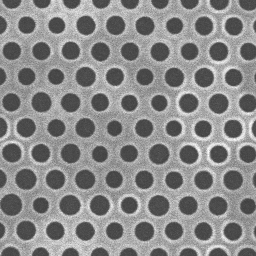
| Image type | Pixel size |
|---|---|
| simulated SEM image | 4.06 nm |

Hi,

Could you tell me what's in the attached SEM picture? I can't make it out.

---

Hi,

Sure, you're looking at a regular array of holes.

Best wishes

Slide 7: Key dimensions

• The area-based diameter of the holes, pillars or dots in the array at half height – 0.0753 microns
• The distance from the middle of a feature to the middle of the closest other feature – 0.118 micrometres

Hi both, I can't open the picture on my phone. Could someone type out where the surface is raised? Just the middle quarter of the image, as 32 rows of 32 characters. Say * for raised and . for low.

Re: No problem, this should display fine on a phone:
********************************
****...****...*****..*****...***
***.....***....***....***.....**
***.....***....***....***.....**
***.....***...****....****....**
****...*****.*************...***
********************************
*..*****..********************..
....***....****...****....***...
....***....***....****....***...
....***....***....****....***...
...*****..*****...*****..****...
********************************
*****.**************************
***....*****..****....****...***
***.....***...****....****...***
***.....***...****....***....***
***....****...****....****...***
********************************
********************************
...************..*****...*****..
....***....***....***.....***...
....***....***.....**.....***...
....***....***....***.....***...
*..******.******.*****...*****..
********************************
*****.**************************
***....****...****....****...***
***.....**.....***....***.....**
***.....**.....***....***.....**
***....****...****....****...***
********************************